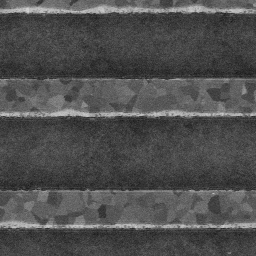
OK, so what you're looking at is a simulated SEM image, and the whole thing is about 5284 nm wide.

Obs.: lines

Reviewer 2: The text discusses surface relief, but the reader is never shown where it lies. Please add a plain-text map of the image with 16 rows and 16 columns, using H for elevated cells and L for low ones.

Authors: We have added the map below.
HHHHHHHHHHHHHHHH
LLLLLLLLLLLLLLLL
LLLLLLLLLLLLLLLL
LLLLLLLLLLLLLLLL
LLLLLLLLLLLLLLLL
HHHHHHHHHHHHHHHH
HHHHHHHHHHHHHHHH
LLLLLLLLLLLLLLLL
LLLLLLLLLLLLLLLL
LLLLLLLLLLLLLLLL
LLLLLLLLLLLLLLLL
LLLLLLLLLLLLLLLL
HHHHHHHHHHHHHHHH
HHHHHHHHHHHHHHHH
LLLLLLLLLLLLLLLL
LLLLLLLLLLLLLLLL